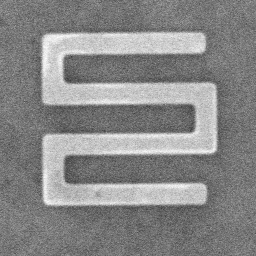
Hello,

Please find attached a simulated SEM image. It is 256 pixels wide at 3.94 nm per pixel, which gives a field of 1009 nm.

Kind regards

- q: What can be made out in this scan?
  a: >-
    groups of lines, slits or small figures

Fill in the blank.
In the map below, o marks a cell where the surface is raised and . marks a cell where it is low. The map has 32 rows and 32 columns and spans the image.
................................
................................
................................
................................
........ooooooooooooooooo.......
......oooooooooooooooooooo......
......ooooooooooooooooooo.......
......oo........................
.....ooo........................
.....ooo........................
.....oooo..............ooo......
.....oooooooooooooooooooooo.....
.....oooooooooooooooooooooo.....
........................ooo.....
.........................oo.....
.........................oo.....
........................ooo.....
.....oooooooooooooooooooooo.....
.....oooooooooooooooooooooo.....
.....ooo........................
.....ooo........................
.....ooo........................
......oo........................
......oooooooooooooooooooo......
......oooooooooooooooooooo......
........ooo.....................
................................
................................
................................
................................
................................
................................